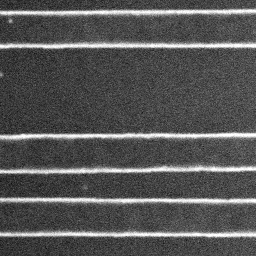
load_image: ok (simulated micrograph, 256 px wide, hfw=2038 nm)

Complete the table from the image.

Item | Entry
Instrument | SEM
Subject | lines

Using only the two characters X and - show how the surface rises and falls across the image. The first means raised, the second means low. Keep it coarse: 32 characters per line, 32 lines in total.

--------------------------------
---------------------XXXXXX-XXXX
XXXXXXXXXXXXXXXXXXXXXXXXXXXXXXXX
XXXXXXXXXXXXXXXXXXXXXXXXXXXXXXXX
XXXXXXXXXXXXXXXXXXXXXXXXXXXXXXXX
XXXXXXXXXXXXXXXXXXXXXXXXXXXXXXXX
--------------------------------
--------------------------------
--------------------------------
--------------------------------
--------------------------------
--------------------------------
--------------------------------
--------------------------------
--------------------------------
--------------------------------
--------------------------------
XXXXXXXXXXXXXXXXXXXXXXXXXXXXXXXX
XXXXXXXXXXXXXXXXXXXXXXXXXXXXXXXX
XXXXXXXXXXXXXXXXXXXXXXXXXXXXXXXX
XXXXXXXXXXXXXXXXXXXXXXXXXXXXXXXX
XX------------------------------
--------------------------------
--------------------------------
--------------------------------
XXXXXXXXXXXXXXXXXXXXXXXXXXXXXXXX
XXXXXXXXXXXXXXXXXXXXXXXXXXXXXXXX
XXXXXXXXXXXXXXXXXXXXXXXXXXXXXXXX
XXXXXXXXXXXXXXXXXXXXXXXXXXXXXXXX
--------------------------------
--------------------------------
--------------------------------